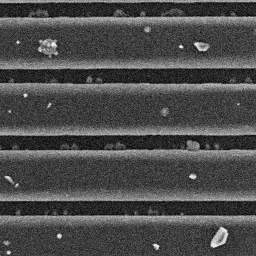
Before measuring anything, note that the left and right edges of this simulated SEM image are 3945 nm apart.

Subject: lines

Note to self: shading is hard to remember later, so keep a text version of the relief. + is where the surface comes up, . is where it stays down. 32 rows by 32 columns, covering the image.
................................
................................
...+..++++++++++++++++++++++++++
++++++++++++++++++++++++++++++++
++++++++++++++++++++++++++++++++
++++++++++++++++++++++++++++++++
++++++++++++++++++++++++++++++++
++++++++++++++++++++++++++++++++
................................
................................
................................
++++++++++++++++++++++++++++++++
++++++++++++++++++++++++++++++++
++++++++++++++++++++++++++++++++
++++++++++++++++++++++++++++++++
++++++++++++++++++++++++++++++++
++++++++++++++++++++++++++++++++
................................
................................
++++++++++++++++++++++++++++++++
++++++++++++++++++++++++++++++++
++++++++++++++++++++++++++++++++
++++++++++++++++++++++++++++++++
++++++++++++++++++++++++++++++++
++++++++++++++++++++++++++++++++
................................
................................
++++++++++++++++++++++++++++++++
++++++++++++++++++++++++++++++++
++++++++++++++++++++++++++++++++
++++++++++++++++++++++++++++++++
++++++++++++++++++++++++++++++++